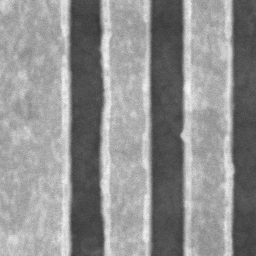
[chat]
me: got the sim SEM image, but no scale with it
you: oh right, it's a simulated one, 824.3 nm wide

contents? one or a few lines or trenches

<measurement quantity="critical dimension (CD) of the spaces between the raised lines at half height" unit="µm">0.122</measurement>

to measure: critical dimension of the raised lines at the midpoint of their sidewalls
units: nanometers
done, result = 140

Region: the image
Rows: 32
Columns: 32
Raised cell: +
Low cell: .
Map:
++++++++.....++++++....++++++...
++++++++.....++++++....++++++...
++++++++.....++++++....++++++...
++++++++.....+++++.....++++++...
++++++++.....+++++.....++++++...
++++++++.....+++++.....++++++...
++++++++.....+++++.....++++++...
++++++++.....+++++.....++++++...
++++++++.....+++++.....++++++...
++++++++.....+++++.....++++++...
++++++++.....+++++.....++++++...
++++++++.....+++++.....++++++...
++++++++.....+++++.....++++++...
++++++++.....+++++.....++++++...
++++++++.....+++++.....++++++...
++++++++.....+++++.....++++++...
++++++++.....+++++.....++++++...
++++++++.....+++++.....++++++...
++++++++.....+++++.....++++++...
++++++++.....+++++.....++++++...
++++++++.....+++++.....++++++...
++++++++.....+++++.....++++++...
++++++++.....+++++.....++++++...
++++++++.....++++++....++++++...
+++++++++....++++++....++++++...
++++++++.....++++++....++++++...
++++++++.....++++++....++++++...
++++++++.....+++++.....++++++...
++++++++.....+++++.....++++++...
++++++++.....++++++....++++++...
++++++++.....+++++.....++++++...
++++++++.....+++++.....++++++...